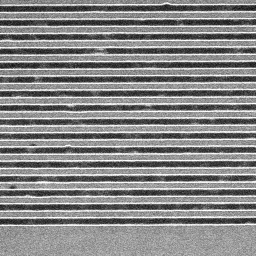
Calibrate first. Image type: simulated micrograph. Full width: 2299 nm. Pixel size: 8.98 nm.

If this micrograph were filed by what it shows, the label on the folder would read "parallel lines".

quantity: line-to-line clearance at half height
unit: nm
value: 53.9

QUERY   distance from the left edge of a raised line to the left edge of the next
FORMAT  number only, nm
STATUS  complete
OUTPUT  127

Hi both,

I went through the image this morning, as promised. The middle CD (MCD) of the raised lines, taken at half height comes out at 0.0729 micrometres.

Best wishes